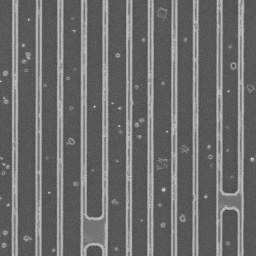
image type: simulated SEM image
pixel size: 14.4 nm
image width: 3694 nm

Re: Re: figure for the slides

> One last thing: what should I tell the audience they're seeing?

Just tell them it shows parallel lines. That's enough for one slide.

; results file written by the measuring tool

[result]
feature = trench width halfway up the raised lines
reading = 285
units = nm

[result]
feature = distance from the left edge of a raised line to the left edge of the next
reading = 326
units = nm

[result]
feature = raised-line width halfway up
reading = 54.1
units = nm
